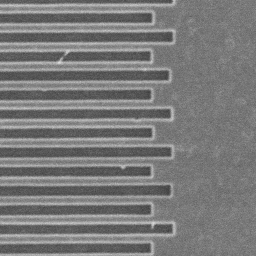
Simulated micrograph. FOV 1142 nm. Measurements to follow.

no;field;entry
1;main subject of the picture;parallel lines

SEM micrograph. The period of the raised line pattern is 85.7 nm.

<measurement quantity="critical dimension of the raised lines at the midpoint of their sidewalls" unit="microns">0.038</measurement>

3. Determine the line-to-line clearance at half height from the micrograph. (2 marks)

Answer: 49.7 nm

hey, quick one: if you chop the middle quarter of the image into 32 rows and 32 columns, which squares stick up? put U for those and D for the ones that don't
UUUUUUUUUUUUUUUUUUUUUUUUUUUUUUUU
DDDDDDDDDDDDDDDDDDDDUDDDDDUUUUUU
DDDDDDDDDDDDDDDDDDDDDDDDDDDUUUUU
DDDDDDDDDDDDDDDDDDDDDDDDDDDUUUUU
DDUUUUUUUUUUUUUUUUUUUUUUUUUUUUUU
UUUUUUUUUUUUUUUUUUUUUUUUUUUUUUUU
DDDDDDDDDDDDDDDDDDDDDDUUUUUUUUUU
DDDDDDDDDDDDDDDDDDDDDDUUUUUUUUUU
DDDDDDDDDDDDDDDDDDDDDDUUUUUUUUUU
UUUUUUUUUUUUUUUUUUUUUUUUUUUUUUUU
UUUUUUUUUUUUUUUUUUUUUUUUUUUUUUUU
DDDDDDDDDDDDDDDDDDDDDDDDDDDUUUUU
DDDDDDDDDDDDDDDDDDDDDDDDDDDUUUUU
DDDDDDDDDDDDDDDDDDDDDDDDDDDUUUUU
UUUUUUUUUUUUUUUUUUUUUUUUUUUUUUUU
UUUUUUUUUUUUUUUUUUUUUUUUUUUUUUUU
DDDDDDDDDDDDDDDDDDDDDDUUUUUUUUUU
DDDDDDDDDDDDDDDDDDDDDDUUUUUUUUUU
DDDDDDDDDDDDDDDDDDDDDDUUUUUUUUUU
UUUUUUUUUUUUUUUUUUUUUUUUUUUUUUUU
UUUUUUUUUUUDDUUUUUUUUUUUUUUUUUUU
DDDDDDDDDDDDDDDDDDDDDDDDDDDUUUUU
DDDDDDDDDDDDDDDDDDDDDDDDDDDUUUUU
UUUUUUUUUUDDDDUUUUUUUUUUUUUUUUUU
UUUUUUUUUUUUUUUUUUUUUUUUUUUUUUUU
DDDDDDDDDDDDDDUUDDDDDUUUUUUUUUUU
DDDDDDDDDDDDDDDDDDDDDDUUUUUUUUUU
DDDDDDDDDDDDDDDDDDDDDDUUUUUUUUUU
UUUUUUUUUUUUUUUUUUUUUUUUUUUUUUUU
UUUUUUUUUUUUUUUUUUUUUUUUUUUUUUUU
DDDDDDDDDDDDDDDDDDDDDDDDDDDUUUUU
DDDDDDDDDDDDDDDDDDDDDDDDDDDUUUUU